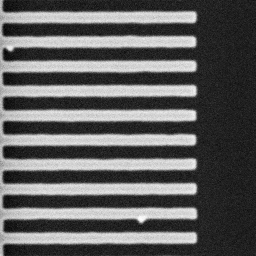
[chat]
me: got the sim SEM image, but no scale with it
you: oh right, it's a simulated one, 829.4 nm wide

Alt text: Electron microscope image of groups of lines, slits or small figures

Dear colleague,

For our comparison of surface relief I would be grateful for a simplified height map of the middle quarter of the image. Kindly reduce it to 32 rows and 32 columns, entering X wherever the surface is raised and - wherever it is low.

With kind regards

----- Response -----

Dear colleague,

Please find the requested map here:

XXXXXXXXXXXXXXXXXXXXXXXXXXXXXXXX
XXXXXXXXXXXXXXXXXXXXXXXXXXXXXXXX
--------------------------------
--------------------------------
--------------------------------
XXXXXXXXXXXXXXXXXXXXXXXXXXXXXXXX
XXXXXXXXXXXXXXXXXXXXXXXXXXXXXXXX
XXXXXXXXXXXXXXXXXXXXXXXXXXXXXXXX
--------------------------------
--------------------------------
--------------------------------
--------------------------------
XXXXXXXXXXXXXXXXXXXXXXXXXXXXXXXX
XXXXXXXXXXXXXXXXXXXXXXXXXXXXXXXX
--------------------------------
--------------------------------
--------------------------------
--------------------------------
XXXXXXXXXXXXXXXXXXXXXXXXXXXXXXXX
XXXXXXXXXXXXXXXXXXXXXXXXXXXXXXXX
--------------------------------
--------------------------------
--------------------------------
--------------------------------
XXXXXXXXXXXXXXXXXXXXXXXXXXXXXXXX
XXXXXXXXXXXXXXXXXXXXXXXXXXXXXXXX
--------------------------------
--------------------------------
--------------------------------
--------------------------------
XXXXXXXXXXXXXXXXXXXXXXXXXXXXXXXX
XXXXXXXXXXXXXXXXXXXXXXXXXXXXXXXX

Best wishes